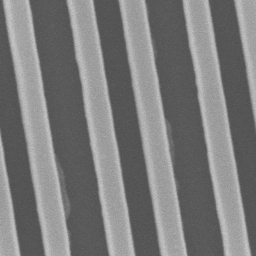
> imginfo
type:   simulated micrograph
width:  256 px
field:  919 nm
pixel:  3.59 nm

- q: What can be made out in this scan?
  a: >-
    lines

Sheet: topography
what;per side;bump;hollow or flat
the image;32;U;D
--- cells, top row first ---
DUUUDDDDUUUUDDDUUUDDDDDUUUDDDUUU
DUUUDDDDDUUUDDDUUUDDDDDUUUDDDDUU
DUUUDDDDDUUUDDDUUUUDDDDUUUDDDDUU
DUUUDDDDDUUUDDDUUUUDDDDUUUUDDDUU
DUUUDDDDDUUUDDDDUUUDDDDDUUUDDDUU
DUUUDDDDDUUUUDDDUUUDDDDDUUUDDDUU
DUUUUDDDDUUUUDDDUUUDDDDDUUUDDDUU
DDUUUDDDDDUUUDDDUUUDDDDDUUUDDDDU
DDUUUDDDDDUUUDDDUUUUDDDDUUUDDDDU
DDUUUDDDDDUUUDDDDUUUDDDDDUUUDDDU
DDUUUDDDDDUUUDDDDUUUDDDDDUUUDDDU
DDUUUDDDDDUUUDDDDUUUDDDDDUUUDDDU
DDUUUUDDDDUUUUDDDUUUDDDDDUUUDDDU
DDDUUUDDDDDUUUDDDUUUDDDDDUUUDDDD
DDDUUUDDDDDUUUDDDUUUDDDDDUUUDDDD
DDDUUUDDDDDUUUDDDUUUUDDDDUUUUDDD
DDDUUUDDDDDUUUDDDDUUUDDDDDUUUDDD
DDDUUUDDDDDUUUUDDDUUUDDDDDUUUDDD
DDDDUUUDDDDUUUUDDDUUUDDDDDUUUDDD
DDDDUUUDDDDDUUUDDDUUUDDDDDUUUDDD
UDDDUUUDDDDDUUUDDDUUUDDDDDUUUDDD
UDDDUUUDDDDDUUUDDDUUUUDDDDUUUUDD
UDDDUUUDDDDDUUUDDDDUUUDDDDDUUUDD
UDDDUUUUDDDDUUUUDDDUUUDDDDDUUUDD
UDDDDUUUDDDDUUUUDDDUUUDDDDDUUUDD
UUDDDUUUDDDDDUUUDDDUUUDDDDDUUUDD
UUDDDUUUDDDDDUUUDDDUUUUDDDDUUUDD
UUDDDUUUDDDDDUUUDDDUUUUDDDDUUUUD
UUDDDUUUDDDDDUUUDDDDUUUDDDDDUUUD
UUDDDUUUDDDDDUUUDDDDUUUDDDDDUUUD
UUDDDUUUUDDDDUUUUDDDUUUDDDDDUUUD
UUDDDDUUUDDDDDUUUDDDUUUDDDDDUUUD